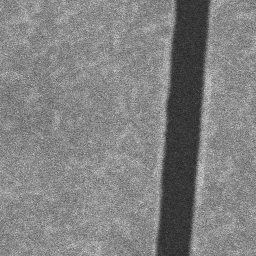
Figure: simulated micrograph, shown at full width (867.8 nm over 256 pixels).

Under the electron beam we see one or a few lines or trenches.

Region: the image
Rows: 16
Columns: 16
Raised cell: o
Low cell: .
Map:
ooooooooooo..ooo
ooooooooooo..ooo
ooooooooooo..ooo
ooooooooooo..ooo
ooooooooooo..ooo
ooooooooooo..ooo
oooooooooo...ooo
oooooooooo...ooo
oooooooooo...ooo
oooooooooo..oooo
oooooooooo..oooo
oooooooooo..oooo
oooooooooo..oooo
oooooooooo..oooo
oooooooooo..oooo
oooooooooo..oooo